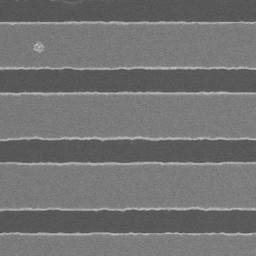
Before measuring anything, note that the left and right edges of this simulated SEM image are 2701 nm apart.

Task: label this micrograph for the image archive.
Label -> lines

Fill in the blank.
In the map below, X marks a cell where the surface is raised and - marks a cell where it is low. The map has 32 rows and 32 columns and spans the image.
--------------------------------
--------------------------------
--------------------------------
XXXXXXXXXXXXXXXXXXXXXXXXXXXXXXXX
XXXXXXXXXXXXXXXXXXXXXXXXXXXXXXXX
XXXXXXXXXXXXXXXXXXXXXXXXXXXXXXXX
XXXXXXXXXXXXXXXXXXXXXXXXXXXXXXXX
XXXXXXXXXXXXXXXXXXXXXXXXXXXXXXXX
XXXXXXXXXXXXXXXXXXXXXXXXXXXXXXXX
--------------------------------
--------------------------------
--------------------------------
XXXXXXXXXXXXXXXXXXXXXXXXXXXXXXXX
XXXXXXXXXXXXXXXXXXXXXXXXXXXXXXXX
XXXXXXXXXXXXXXXXXXXXXXXXXXXXXXXX
XXXXXXXXXXXXXXXXXXXXXXXXXXXXXXXX
XXXXXXXXXXXXXXXXXXXXXXXXXXXXXXXX
X------------------X------------
--------------------------------
--------------------------------
XXXXXXXXXXXXXXXXXXXXXXXXXXXXXXXX
XXXXXXXXXXXXXXXXXXXXXXXXXXXXXXXX
XXXXXXXXXXXXXXXXXXXXXXXXXXXXXXXX
XXXXXXXXXXXXXXXXXXXXXXXXXXXXXXXX
XXXXXXXXXXXXXXXXXXXXXXXXXXXXXXXX
XXXXXXXXXXXXXXXXXXXXXXXXXXXXXXXX
--------------------------------
--------------------------------
--------------------------------
XXXXXXXXXXXXXXXXXXXXXXXXXXXXXXXX
XXXXXXXXXXXXXXXXXXXXXXXXXXXXXXXX
XXXXXXXXXXXXXXXXXXXXXXXXXXXXXXXX